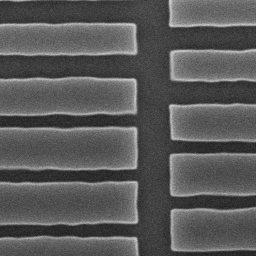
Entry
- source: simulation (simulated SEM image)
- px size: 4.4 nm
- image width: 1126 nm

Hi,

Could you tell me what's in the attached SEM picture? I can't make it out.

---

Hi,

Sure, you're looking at groups of lines, slits or small figures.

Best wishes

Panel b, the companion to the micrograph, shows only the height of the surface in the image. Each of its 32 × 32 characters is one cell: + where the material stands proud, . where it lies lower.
.....................+++++++++++
.....................+++++++++++
.....................+++++++++++
+++++++++++++++++...............
+++++++++++++++++...............
+++++++++++++++++...............
+++++++++++++++++.....++++++++++
.....................+++++++++++
.....................+++++++++++
.....................+++++++++++
+++++++++++++++++...............
+++++++++++++++++...............
+++++++++++++++++...............
+++++++++++++++++....+++++++++++
.....................+++++++++++
.....................+++++++++++
+++++++++++++++++....+++++++++++
+++++++++++++++++......+++++++++
+++++++++++++++++...............
+++++++++++++++++.....++++++++++
+++++++++++++++++....+++++++++++
.....................+++++++++++
.....................+++++++++++
+++++++++++++++++....+++++++++++
+++++++++++++++++.....++........
+++++++++++++++++...............
+++++++++++++++++.....++++++++++
+++++++++++++++++....+++++++++++
.....................+++++++++++
.....................+++++++++++
+++++++++++++++++.....++++++++++
+++++++++++++++++...............